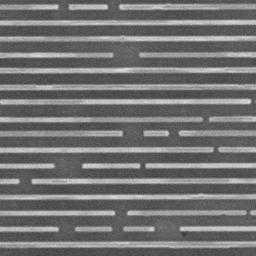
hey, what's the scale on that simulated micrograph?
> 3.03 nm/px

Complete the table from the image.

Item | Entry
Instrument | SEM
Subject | parallel lines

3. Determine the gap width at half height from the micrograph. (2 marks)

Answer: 11.7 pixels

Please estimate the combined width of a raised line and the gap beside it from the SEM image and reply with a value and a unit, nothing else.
48 nm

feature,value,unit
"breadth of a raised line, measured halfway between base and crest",12.9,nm